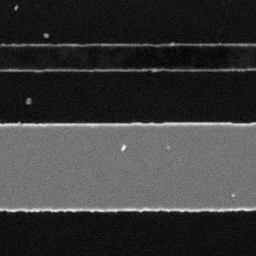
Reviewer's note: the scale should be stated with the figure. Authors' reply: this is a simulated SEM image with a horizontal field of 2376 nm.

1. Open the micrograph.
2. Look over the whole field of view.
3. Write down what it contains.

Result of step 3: lines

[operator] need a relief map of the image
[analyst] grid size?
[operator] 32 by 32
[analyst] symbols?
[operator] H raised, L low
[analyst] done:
LLLLLLLLLLLLLLLLLLLLLLLLLLLLLLLL
LLLLLLLLLLLLLLLLLLLLLLLLLLLLLLLL
LLLLLLLLLLLLLLLLLLLLLLLLLLLLLLLL
LLLLLLLLLLLLLLLLLLLLLLLLLLLLLLLL
LLLLLLLLLLLLLLLLLLLLLLLLLLLLLLLL
LLLLLLLLLLLLLLLLLLLLLLLLLLLLLLLL
HHHHHHHHHHHHHHHHHHHHHHHHHHHHHHHH
HHHHHHHHHHHHHHHHHHHHHHHHHHHHHHHH
HHHHHHHHHHHHHHHHHHHHHHHHHHHHHHHH
LLLLLLLLLLLLLLLLLLLLLLLLLLLLLLLL
LLLLLLLLLLLLLLLLLLLLLLLLLLLLLLLL
LLLLLLLLLLLLLLLLLLLLLLLLLLLLLLLL
LLLLLLLLLLLLLLLLLLLLLLLLLLLLLLLL
LLLLLLLLLLLLLLLLLLLLLLLLLLLLLLLL
LLLLLLLLLLLLLLLLLLLLLLLLLLLLLLLL
LLHLLLLLLLLLLLLLHHLLHHHHHHHHHLLH
HHHHHHHHHHHHHHHHHHHHHHHHHHHHHHHH
HHHHHHHHHHHHHHHHHHHHHHHHHHHHHHHH
HHHHHHHHHHHHHHHHHHHHHHHHHHHHHHHH
HHHHHHHHHHHHHHHHHHHHHHHHHHHHHHHH
HHHHHHHHHHHHHHHHHHHHHHHHHHHHHHHH
HHHHHHHHHHHHHHHHHHHHHHHHHHHHHHHH
HHHHHHHHHHHHHHHHHHHHHHHHHHHHHHHH
HHHHHHHHHHHHHHHHHHHHHHHHHHHHHHHH
HHHHHHHHHHHHHHHHHHHHHHHHHHHHHHHH
HHHHHHHHHHHHHHHHHHHHHHHHHHHHHHHH
LLLLLLLLLLLLLLLLLLLLLLLLLLLLLLLL
LLLLLLLLLLLLLLLLLLLLLLLLLLLLLLLL
LLLLLLLLLLLLLLLLLLLLLLLLLLLLLLLL
LLLLLLLLLLLLLLLLLLLLLLLLLLLLLLLL
LLLLLLLLLLLLLLLLLLLLLLLLLLLLLLLL
LLLLLLLLLLLLLLLLLLLLLLLLLLLLLLLL